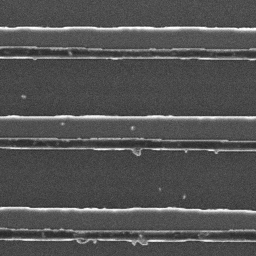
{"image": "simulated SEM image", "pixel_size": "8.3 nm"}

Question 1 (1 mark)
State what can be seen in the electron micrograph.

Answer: lines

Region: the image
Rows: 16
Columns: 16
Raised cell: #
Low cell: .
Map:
................
................
################
################
................
................
................
################
################
........#.......
................
................
................
################
################
................